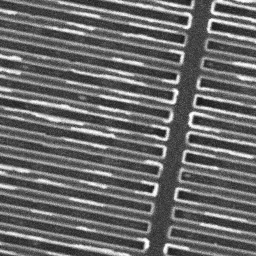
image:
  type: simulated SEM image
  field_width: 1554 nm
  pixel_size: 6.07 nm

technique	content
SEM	parallel lines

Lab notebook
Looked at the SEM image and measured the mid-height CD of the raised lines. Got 59.5 nm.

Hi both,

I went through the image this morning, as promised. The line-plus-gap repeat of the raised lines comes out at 116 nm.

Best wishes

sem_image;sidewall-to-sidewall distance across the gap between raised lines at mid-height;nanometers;54.3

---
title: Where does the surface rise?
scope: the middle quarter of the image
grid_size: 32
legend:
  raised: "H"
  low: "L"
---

HHHHHHHLLLLLLLLLLLLHHHHHHHHHHHHH
HHHHHHHHHHHHLLLLLLLLLLLLHHHHHHHH
LLLLLHHHHHHHHHHHHLLLLLLLLLLLHHHH
LLLLLLLLLLHHHHHHHHHHHHLLLLLLHHHH
HHLLLLLLLLLLLLLHHHHHHHHHHHHHHHHH
HHHHHHHLLLLLLLLLLLLLHHHHHHHHHHHH
LHHHHHHHHHHHLLLLLLLLLLLLLLHHHHHH
LLLLLLHHHHHHHHHHHLLLLLLLLLLHHHHH
LLLLLLLLLLHHHHHHHHHHHHHHLLLHHHHH
HHHLLLLLLLLLLLLHHHHHHHHHHHHHHHHH
HHHHHHHHLLLLLLLLLLLLLHHHHHHHHHHH
LHHHHHHHHHHHHHLLLLLLLLLLLLHHHHHH
LLLLLLHHHHHHHHHHHHHLLLLLLLLHHHHH
LLLLLLLLLLLLHHHHHHHHHHHHLLHHHHHH
HHHHHLLLLLLLLLLLLHHHHHHHHHHHHHHH
HHHHHHHHHHLLLLLLLLLLLLHHHHHHHHHH
LHHHHHHHHHHHHHHLLLLLLLLLLLHHHHHH
LLLLLLLLHHHHHHHHHHHHLLLLLLHHHHHH
LLLLLLLLLLLLLHHHHHHHHHHHHHHHHHHL
HHHHHLLLLLLLLLLLLLHHHHHHHHHHHHHL
HHHHHHHHHHHLLLLLLLLLLLLHHHHHHHHH
LLLHHHHHHHHHHHHLLLLLLLLLLHHHHHHH
LLLLLLLLHHHHHHHHHHHHLLLLLHHHHHLL
HLLLLLLLLLLLLHHHHHHHHHHHHHHHHHLL
HHHHHHLLLLLLLLLLLLHHHHHHHHHHHHLL
HHHHHHHHHHHLLLLLLLLLLLLHHHHHHHHH
LLLLHHHHHHHHHHHLLLLLLLLLHHHHHHHH
LLLLLLLLLHHHHHHHHHHHHLLLHHHHHLLL
HLLLLLLLLLLLLLHHHHHHHHHHHHHHHLLL
HHHHHHLLLLLLLLLLLLLHHHHHHHHHHHHL
HHHHHHHHHHHLLLLLLLLLLLLHHHHHHHHH
LLLLHHHHHHHHHHHHLLLLLLHHHHHHHLHH